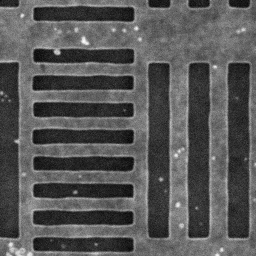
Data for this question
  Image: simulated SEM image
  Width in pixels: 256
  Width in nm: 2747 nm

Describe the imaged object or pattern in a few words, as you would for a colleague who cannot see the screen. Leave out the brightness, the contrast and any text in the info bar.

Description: groups of lines, slits or small figures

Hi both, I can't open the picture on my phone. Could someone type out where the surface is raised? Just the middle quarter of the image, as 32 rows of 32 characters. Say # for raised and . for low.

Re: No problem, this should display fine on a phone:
#####################......####.
#####################......####.
#####################......####.
..................###......####.
..................###......####.
..................###......####.
.................####......####.
#####################.....#####.
#####################......####.
......###############......####.
..................###......####.
..................###......####.
..................###......####.
#................####......####.
#####################......####.
#####################......####.
.................####......####.
..................###......####.
..................###......####.
..................###......####.
#####################......####.
#####################......####.
#####################......####.
..................###......####.
..................###......####.
..................###......####.
.................####......####.
#####################......####.
#####################......####.
#####################......####.
.................####......####.
..................###......####.